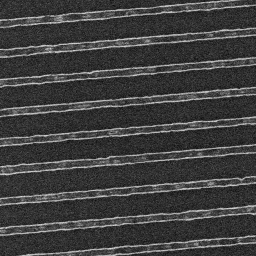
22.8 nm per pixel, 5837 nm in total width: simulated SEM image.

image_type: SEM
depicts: parallel lines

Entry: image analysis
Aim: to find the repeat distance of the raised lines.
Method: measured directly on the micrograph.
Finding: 674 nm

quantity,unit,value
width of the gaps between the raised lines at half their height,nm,511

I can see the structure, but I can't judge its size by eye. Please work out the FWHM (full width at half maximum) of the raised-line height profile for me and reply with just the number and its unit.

0.168 micrometres